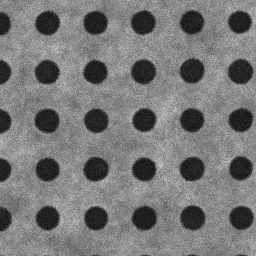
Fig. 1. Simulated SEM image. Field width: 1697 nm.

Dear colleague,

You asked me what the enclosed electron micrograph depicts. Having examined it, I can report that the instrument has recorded a regular array of holes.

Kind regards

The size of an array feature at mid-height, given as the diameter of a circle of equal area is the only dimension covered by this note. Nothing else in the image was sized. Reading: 25.2 px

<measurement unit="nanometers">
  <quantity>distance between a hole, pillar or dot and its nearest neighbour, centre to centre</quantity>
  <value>320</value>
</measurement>